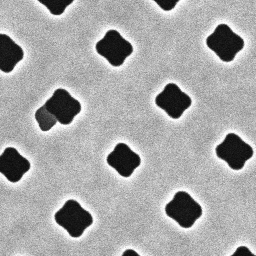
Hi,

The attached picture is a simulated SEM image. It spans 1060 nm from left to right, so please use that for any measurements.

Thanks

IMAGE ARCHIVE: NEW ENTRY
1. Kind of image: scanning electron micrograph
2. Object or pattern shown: a regular array of holes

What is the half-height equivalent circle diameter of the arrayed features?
137 nm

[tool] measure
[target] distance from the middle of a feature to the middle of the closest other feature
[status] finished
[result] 320 nm